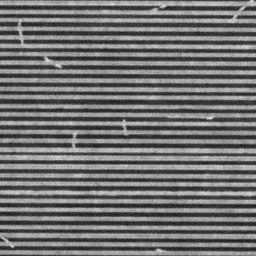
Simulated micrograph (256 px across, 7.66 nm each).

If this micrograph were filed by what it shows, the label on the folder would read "parallel lines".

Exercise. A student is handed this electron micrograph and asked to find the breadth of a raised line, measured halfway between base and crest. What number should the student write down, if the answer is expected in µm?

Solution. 0.023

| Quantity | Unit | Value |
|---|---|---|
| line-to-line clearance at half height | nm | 44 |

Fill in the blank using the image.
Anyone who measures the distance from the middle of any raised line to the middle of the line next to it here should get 65.9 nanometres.